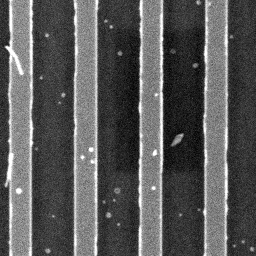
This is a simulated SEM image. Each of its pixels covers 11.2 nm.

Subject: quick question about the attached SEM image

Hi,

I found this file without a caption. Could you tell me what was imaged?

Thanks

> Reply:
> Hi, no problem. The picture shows lines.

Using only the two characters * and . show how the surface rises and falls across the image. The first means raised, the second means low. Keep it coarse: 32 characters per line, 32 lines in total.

.***.....***......**......**....
.***......**......**......**....
.***.....***......**......**....
.***......**......**......**....
.***.....***......**......**....
.***......**......**......**....
.***......**......**......**....
.***......**......**......**....
.***......**......**......**....
.***.....***......**......**....
.***.....***......**......**....
.***.....***......**......**....
.***.....***.....***......**....
.***.....***.....***......**....
.***.....***.....***......**....
.***.....***......**......**....
.***.....***......**......**....
.***.....***......**......**....
.***.....***......**......**....
.***.....***.....***......**....
.***.....***.....***......**....
.***.....***.....***......**....
.***.....***.....***......**....
.***.....***.....***......**....
.***.....***.....***......**....
.***.....***.....***......**....
.***.....***......**......**....
.***.....***......**......**....
.***.....***.....***......**....
.***.....***.....***......**....
.***.....***.....***......**....
.***.....***.....***......**....